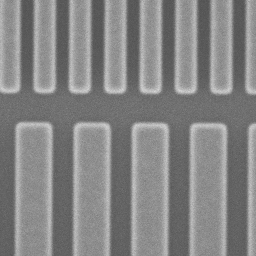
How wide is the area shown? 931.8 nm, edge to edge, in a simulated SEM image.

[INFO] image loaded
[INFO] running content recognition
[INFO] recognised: groups of lines, slits or small figures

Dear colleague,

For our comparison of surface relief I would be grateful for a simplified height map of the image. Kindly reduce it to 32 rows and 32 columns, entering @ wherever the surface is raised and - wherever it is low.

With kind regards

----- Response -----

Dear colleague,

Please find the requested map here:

@@--@@@--@@--@@@--@@--@@@-@@@--@
@@--@@@--@@--@@@--@@--@@@-@@@--@
@@--@@@--@@--@@@--@@--@@@-@@@--@
@@--@@@--@@--@@@--@@--@@@-@@@--@
@@--@@@--@@--@@@--@@--@@@-@@@--@
@@--@@@--@@--@@@--@@--@@@-@@@--@
@@--@@@--@@--@@@--@@--@@@-@@@--@
@@--@@@--@@--@@@--@@--@@@-@@@--@
@@--@@@--@@--@@@--@@--@@@-@@@--@
@@--@@@--@@--@@@--@@--@@@-@@@--@
@@--@@@--@@--@@@--@@--@@@-@@@--@
---------@@---@---@@--@@---@---@
--------------------------------
--------------------------------
--------------------------------
--@@@@----@@@----@@@------------
--@@@@---@@@@@---@@@@---@@@@---@
--@@@@---@@@@@---@@@@---@@@@---@
--@@@@---@@@@@---@@@@---@@@@---@
--@@@@---@@@@@---@@@@---@@@@---@
--@@@@---@@@@@---@@@@---@@@@---@
--@@@@---@@@@@---@@@@---@@@@---@
--@@@@---@@@@@---@@@@---@@@@---@
--@@@@---@@@@@---@@@@---@@@@---@
--@@@@---@@@@@---@@@@---@@@@---@
--@@@@---@@@@@---@@@@---@@@@---@
--@@@@---@@@@@---@@@@---@@@@---@
--@@@@---@@@@@---@@@@---@@@@---@
--@@@@---@@@@@---@@@@---@@@@---@
--@@@@---@@@@@---@@@@---@@@@---@
--@@@@---@@@@@---@@@@---@@@@---@
--@@@@---@@@@@---@@@@---@@@@---@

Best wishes